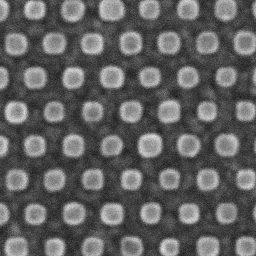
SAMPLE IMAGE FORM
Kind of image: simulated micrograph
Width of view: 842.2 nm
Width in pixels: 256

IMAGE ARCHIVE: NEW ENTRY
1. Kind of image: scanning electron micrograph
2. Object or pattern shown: a regular array of raised bodies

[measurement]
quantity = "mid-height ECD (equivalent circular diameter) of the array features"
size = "68 nanometers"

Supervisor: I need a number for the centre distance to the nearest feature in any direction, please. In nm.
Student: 125